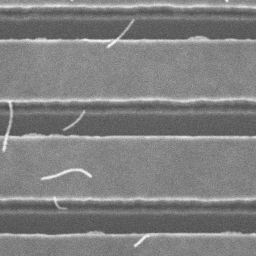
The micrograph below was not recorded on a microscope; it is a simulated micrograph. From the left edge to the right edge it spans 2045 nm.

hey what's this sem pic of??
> lines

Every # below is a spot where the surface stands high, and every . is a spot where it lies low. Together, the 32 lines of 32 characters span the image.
################################
................................
................................
................................
................................
################################
################################
################################
################################
################################
################################
################################
############.####....####.##...#
................................
................................
................................
................................
################################
################################
################################
################################
################################
################################
################################
################################
................................
................................
................................
................................
################################
################################
################################